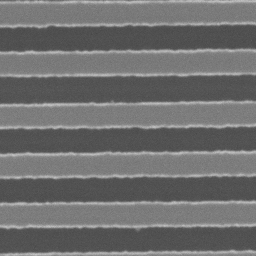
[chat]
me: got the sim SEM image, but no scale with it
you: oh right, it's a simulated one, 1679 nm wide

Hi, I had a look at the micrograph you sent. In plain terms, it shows lines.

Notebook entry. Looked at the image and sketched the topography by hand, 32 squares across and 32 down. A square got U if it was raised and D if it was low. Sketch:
UUUUUUUUUUUUUUUUUUUUUUUUUUUUUUUU
UUUUUUUUUUUUUUUUUUUUUUUUUUUUUUUU
UUUUUUUUUUUUUUUUUUUUUUUUUUUUUUUU
DDDDDDDDDDDDDDDDDDDDDDDDDDDDDDDD
DDDDDDDDDDDDDDDDDDDDDDDDDDDDDDDD
DDDDDDDDDDDDDDDDDDDDDDDDDDDDDDDD
DDDUUDUUDUDUUUUUUUUUUUUUUUUUUUUU
UUUUUUUUUUUUUUUUUUUUUUUUUUUUUUUU
UUUUUUUUUUUUUUUUUUUUUUUUUUUUUUUU
DUUUUUDUDDDDDDDDDDDDDDDDDDDDDDDD
DDDDDDDDDDDDDDDDDDDDDDDDDDDDDDDD
DDDDDDDDDDDDDDDDDDDDDDDDDDDDDDDD
DDDDDDDDDDDDDDDDDDDDDDDDDDDDDDDD
UUUUUUUUUUUUUUUUUUUUUUUUUUUUUUUU
UUUUUUUUUUUUUUUUUUUUUUUUUUUUUUUU
UUUUUUUUUUUUUUUUUUUUUUUUUUUUUUUU
DDDDDDDDDDDDDDDDDDDDDDDDDDDDDDDD
DDDDDDDDDDDDDDDDDDDDDDDDDDDDDDDD
DDDDDDDDDDDDDDDDDDDDDDDDDDDDDDDD
UUUUUUUUUUUUUUUUUUUUUUUUUUUUUUUU
UUUUUUUUUUUUUUUUUUUUUUUUUUUUUUUU
UUUUUUUUUUUUUUUUUUUUUUUUUUUUUUUU
DDDDDDDDDDDDDDDDDDDDDDDDDDDDDDDD
DDDDDDDDDDDDDDDDDDDDDDDDDDDDDDDD
DDDDDDDDDDDDDDDDDDDDDDDDDDDDDDDD
UUUUUUUUUUUUUUUUUUUUUUUUUUUUUUUU
UUUUUUUUUUUUUUUUUUUUUUUUUUUUUUUU
UUUUUUUUUUUUUUUUUUUUUUUUUUUUUUUU
UUUDDDDDDDDDDDDDDDDDDDDDDDDDDDDD
DDDDDDDDDDDDDDDDDDDDDDDDDDDDDDDD
DDDDDDDDDDDDDDDDDDDDDDDDDDDDDDDD
DDDDDDDDDDDDDDDUDDUUUUUUUUUUUUUU